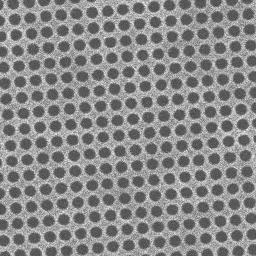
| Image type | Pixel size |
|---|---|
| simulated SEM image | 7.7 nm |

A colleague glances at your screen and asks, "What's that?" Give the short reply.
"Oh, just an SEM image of a regular array of holes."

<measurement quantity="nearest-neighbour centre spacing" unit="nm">118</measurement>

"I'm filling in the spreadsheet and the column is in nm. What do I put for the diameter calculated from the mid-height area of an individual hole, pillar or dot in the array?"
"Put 92.4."